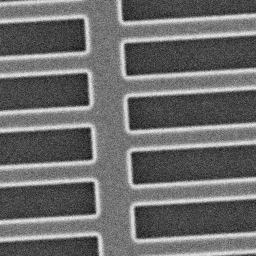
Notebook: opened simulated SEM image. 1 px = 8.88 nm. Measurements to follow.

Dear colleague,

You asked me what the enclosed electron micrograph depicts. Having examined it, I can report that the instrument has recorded groups of lines, slits or small figures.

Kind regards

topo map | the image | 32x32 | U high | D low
UUUUUUUUUUUUUUUDDDDDDDDDDDDDDDDD
UUUUUUUUUUUUUUUDDDDDDDDDDDDDDDDD
UUUUUDDDDDDUUUUDDDDDDUUUUUUUUUUU
DDDDDDDDDDDUUUUUUUUUUUUUUUUUUUUU
DDDDDDDDDDDUUUUUUUUUUUUUUUUUDDDD
DDDDDDDDDDDUUUUUDDDDDDDDDDDDDDDD
DDDDDDDDDDUUUUUDDDDDDDDDDDDDDDDD
UUUUUUUUUUUUUUUUDDDDDDDDDDDDDDDD
UUUUUUUUUUUUUUUUDDDDDDDDDDDDDDDD
UUUDDDDDDDDUUUUUDDUUUUUUUUUUUUUU
DDDDDDDDDDDUUUUUUUUUUUUUUUUUUUUU
DDDDDDDDDDDUUUUUUUUUUUUUUUDDDDDD
DDDDDDDDDDDUUUUUDDDDDDDDDDDDDDDD
DDDDDDDDDUUUUUUUDDDDDDDDDDDDDDDD
UUUUUUUUUUUUUUUUDDDDDDDDDDDDDDDD
UUUUUUUUUUUUUUUUDDDDDDDDDDDDDDDU
DDDDDDDDDDDDUUUUUUUUUUUUUUUUUUUU
DDDDDDDDDDDDUUUUUUUUUUUUUUUUUUUU
DDDDDDDDDDDDUUUUUUUUUUDDDDDDDDDD
DDDDDDDDDDDDUUUUDDDDDDDDDDDDDDDD
DDDDDUUUUUUUUUUUDDDDDDDDDDDDDDDD
UUUUUUUUUUUUUUUUDDDDDDDDDDDDDDDD
UUUUUUUUUUUUUUUUDDDDDDDDDDDDDUUU
DDDDDDDDDDDDUUUUUUUUUUUUUUUUUUUU
DDDDDDDDDDDDUUUUUUUUUUUUUUUUUUUU
DDDDDDDDDDDDUUUUUUUUDDDDDDDDDDDD
DDDDDDDDDDDDUUUUUDDDDDDDDDDDDDDD
DDDUUUUUUUUUUUUUUDDDDDDDDDDDDDDD
UUUUUUUUUUUUUUUUUDDDDDDDDDDDDDDD
UUUUUUUUUDDDUUUUUDDDDDDDDDUUUUUU
DDDDDDDDDDDDUUUUUUUUUUUUUUUUUUUU
DDDDDDDDDDDDUUUUUUUUUUUUUUUUUUUU